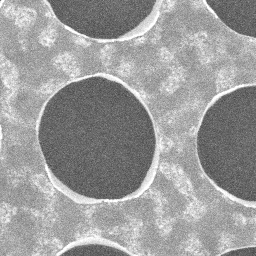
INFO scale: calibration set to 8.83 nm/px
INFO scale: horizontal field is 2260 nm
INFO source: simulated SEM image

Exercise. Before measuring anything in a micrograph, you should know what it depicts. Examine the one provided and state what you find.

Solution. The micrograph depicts holes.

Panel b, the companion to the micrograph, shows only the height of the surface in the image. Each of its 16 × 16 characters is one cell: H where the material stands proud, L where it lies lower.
HHHLLLLLLLHHHLLL
HHHHLLLLLHHHHHLL
HHHHHHHHHHHHHHHH
HHHHHHHHHHHHHHHH
HHHHHHHHHHHHHHHH
HHHHLLLLHHHHHHHL
HHHLLLLLLHHHHLLL
HHHLLLLLLHHHHLLL
HHLLLLLLLLHHLLLL
HHHLLLLLLLHHLLLL
HHHLLLLLLLHHHLLL
HHHHLLLLLHHHHLLL
HHHHHHHHHHHHHHHL
HHHHHHHHHHHHHHHH
HHHHHHHHHHHHHHHH
HHHHLLLHHHHHHHHL